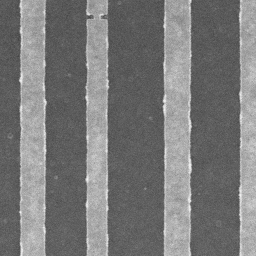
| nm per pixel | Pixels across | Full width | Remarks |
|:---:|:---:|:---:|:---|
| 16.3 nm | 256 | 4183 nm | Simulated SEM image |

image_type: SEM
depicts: one or a few lines or trenches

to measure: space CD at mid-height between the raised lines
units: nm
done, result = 817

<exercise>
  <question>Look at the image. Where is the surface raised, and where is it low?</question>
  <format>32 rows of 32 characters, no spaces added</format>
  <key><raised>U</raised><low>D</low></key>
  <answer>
DDDUUUDDDDDUUDDDDDDDDUUUDDDDDDUU
DDDUUUDDDDDUUDDDDDDDDUUUDDDDDDUU
DDDUUUDDDDDUUDDDDDDDDUUUDDDDDDUU
DDDUUUDDDDDUUDDDDDDDUUUUDDDDDDUU
DDDUUUDDDDDUUDDDDDDDDUUUDDDDDDUU
DDDUUUDDDDDUUDDDDDDDDUUUDDDDDDUU
DDDUUDDDDDDUUDDDDDDDDUUUDDDDDDUU
DDDUUUDDDDDUUDDDDDDDDUUUDDDDDDUU
DDDUUUDDDDDUUDDDDDDDUUUUDDDDDDUU
DDDUUUDDDDDUUDDDDDDDDUUUDDDDDDUU
DDDUUUDDDDDUUUDDDDDDDUUUDDDDDDUU
DDDUUUDDDDDUUDDDDDDDDUUUDDDDDDUU
DDDUUUDDDDDUUDDDDDDDUUUUDDDDDDUU
DDDUUUDDDDDUUDDDDDDDUUUUDDDDDDUU
DDDUUUDDDDDUUDDDDDDDDUUUDDDDDDUU
DDDUUUDDDDDUUDDDDDDDDUUUDDDDDDUU
DDDUUUDDDDDUUDDDDDDDDUUUDDDDDDUU
DDDUUUDDDDDUUDDDDDDDDUUUDDDDDDUU
DDDUUUDDDDDUUDDDDDDDDUUUDDDDDDUU
DDDUUUDDDDDUUDDDDDDDDUUUDDDDDDUU
DDDUUUDDDDDUUDDDDDDDDUUUDDDDDDUU
DDDUUUDDDDDUUDDDDDDDDUUUDDDDDDUU
DDDUUUDDDDDUUDDDDDDDDUUUDDDDDDUU
DDDUUUDDDDDUUDDDDDDDDUUUDDDDDDUU
DDDUUUDDDDDUUDDDDDDDDUUUDDDDDDUU
DDDUUUDDDDDUUDDDDDDDDUUUDDDDDDUU
DDDUUUDDDDDUUDDDDDDDDUUUDDDDDDUU
DDDUUUDDDDDUUDDDDDDDDUUUDDDDDDUU
DDDUUUDDDDDUUDDDDDDDDUUUDDDDDDUU
DDDUUUDDDDDUUDDDDDDDDUUUDDDDDDUU
DDDUUUDDDDDUUDDDDDDDDUUUDDDDDDUU
DDDUUUDDDDDUUDDDDDDDDUUUDDDDDDUU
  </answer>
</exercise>